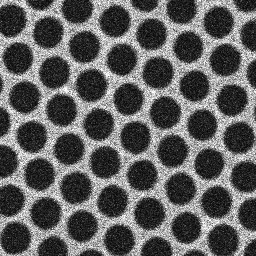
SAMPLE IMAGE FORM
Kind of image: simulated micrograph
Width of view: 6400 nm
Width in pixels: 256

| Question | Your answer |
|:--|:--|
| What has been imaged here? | a regular array of holes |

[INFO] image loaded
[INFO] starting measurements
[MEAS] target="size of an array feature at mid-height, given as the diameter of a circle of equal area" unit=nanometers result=824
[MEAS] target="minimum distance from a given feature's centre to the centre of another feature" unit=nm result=967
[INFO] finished